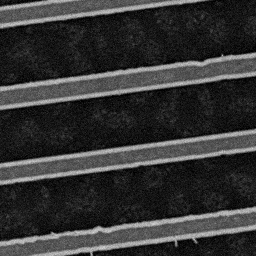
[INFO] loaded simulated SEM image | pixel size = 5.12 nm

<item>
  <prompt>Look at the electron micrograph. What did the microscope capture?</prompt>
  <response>one or a few lines or trenches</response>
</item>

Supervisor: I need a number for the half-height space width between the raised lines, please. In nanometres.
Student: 312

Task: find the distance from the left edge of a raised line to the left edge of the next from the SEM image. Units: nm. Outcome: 393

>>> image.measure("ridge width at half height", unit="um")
0.09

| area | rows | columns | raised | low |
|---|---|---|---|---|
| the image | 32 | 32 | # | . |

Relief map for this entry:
.....###############............
#############...................
######..........................
................................
................................
................................
................................
...........................#####
....................############
............#################...
.....#################..........
###############.................
########........................
................................
................................
................................
................................
........................########
.................###############
.........#################......
..###############...............
##########......................
##..............................
................................
................................
................................
..............................##
......................##########
...............################.
.......##################.......
################................
#########.......................